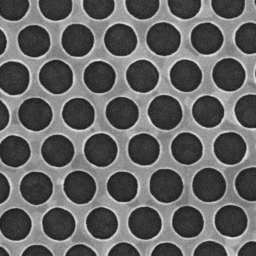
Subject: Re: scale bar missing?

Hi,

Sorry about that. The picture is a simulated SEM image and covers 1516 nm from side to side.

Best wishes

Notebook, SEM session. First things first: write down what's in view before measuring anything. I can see a regular array of holes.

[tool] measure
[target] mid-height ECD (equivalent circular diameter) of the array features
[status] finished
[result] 198 nm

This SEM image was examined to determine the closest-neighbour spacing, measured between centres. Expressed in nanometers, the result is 250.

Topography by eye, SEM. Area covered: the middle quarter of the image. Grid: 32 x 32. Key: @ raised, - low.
-@@@@@------@@@@-------@@@@-----
--@@@--------@@@-------@@@@-----
--@@@--------@@---------@@------
---@@--------@@---------@@------
--@@@--------@@@--------@@@-----
--@@@-------@@@@-------@@@@-----
-@@@@@-----@@@@@@-----@@@@@@----
@@@@@@@@@@@@@@@@@@@@@@@@@@@@@@@@
@@@--@@@@@@@@---@@@@@@------@@@@
@-----@@@@@-------@@@@-------@@@
-------@@@@-------@@@---------@@
-------@@@---------@@---------@@
--------@@---------@@---------@@
--------@@@--------@@---------@@
--------@@@-------@@@@-------@@@
@------@@@@@-----@@@@@------@@@@
@@@--@@@@@@@@@-@@@@@@@@@@-@@@@@@
@@@@@@@@---@@@@@@@@--@@@@@@@@---
-@@@@@------@@@@@------@@@@@----
--@@@--------@@@--------@@@-----
--@@@--------@@@--------@@@-----
---@@---------@@--------@@@-----
---@@--------@@@--------@@@-----
--@@@@-------@@@--------@@@-----
--@@@@------@@@@@------@@@@@@---
@@@@@@@@---@@@@@@@@--@@@@@@@@@@@
@@@@@@@@@@@@@@@@@@@@@@@----@@@@@
@-----@@@@@@-----@@@@@-------@@@
-------@@@@-------@@@@--------@@
--------@@@-------@@@---------@@
--------@@@--------@@---------@@
--------@@@--------@@---------@@